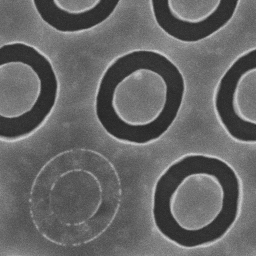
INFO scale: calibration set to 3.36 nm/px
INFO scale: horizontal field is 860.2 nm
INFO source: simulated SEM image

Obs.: ring-shaped grooves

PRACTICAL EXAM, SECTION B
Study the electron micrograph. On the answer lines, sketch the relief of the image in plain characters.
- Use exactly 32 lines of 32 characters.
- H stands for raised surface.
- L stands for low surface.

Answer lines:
HHHHLLLHHHHHLLLHHHHLLHHHHHHLLLHH
HHHHHLLLLHLLLLHHHHHLLLHHHHHLLHHH
HHHHHHLLLLLLLHHHHHHHLLLHHLLLLHHH
HHHHHHHLLLLHHHHHHHHHLLLLLLLLHHHH
HHHHHHHHHHHHHHHHHHHHHLLLLLHHHHHH
HHLHHHHHHHHHHHHHHHHHHHHHHHHHHHHH
LLLLLHHHHHHHHHHHLLLHHHHHHHHHHHHL
LLLLLLHHHHHHHHLLLLLLLHHHHHHHHHLL
HHHHLLLHHHHHHHLLLLLLLLHHHHHHHLLL
HHHHHLLHHHHHHLLLHHHHLLLHHHHHLLHH
HHHHHLLHHHHHHLLHHHHHHLLHHHHLLLHH
HHHHHLLHHHHHLLHHHHHHHLLHHHHLLHHH
HHHHHLLHHHHHLLHHHHHHHLLHHHHLLHHH
HHHHLLLHHHHHLLHHHHHHLLHHHHHLLHHH
HHLLLLHHHHHHLLLHHHHHLLHHHHHLLLHH
LLLLLHHHHHHHHLLLLHLLLHHHHHHHLLLL
LLLLHHHHHHHHHLLLLLLLLHHHHHHHHLLL
HHHHHHHHHHHHHHHLLLLHHHHHHHHHHHLL
HHHHHHHHHHHHHHHHHHHHHHHHHHHHHHHH
HHHHHHHHHHHHHHHHHHHHHHHLLLHHHHHH
HHHHHHHHHHHHHHHHHHHHHHLLLLLLHHHH
HHHHHHHHHHHHHHHHHHHHHLLLLLLLLHHH
HHHHHHHHHHHHHHHHHHHHLLLHHHHLLLHH
HHHHHHHHHHHHHHHHHHHLLLHHHHHHLLHH
HHHHHHHHHHHHHHHHHHHLLLHHHHHHLLHH
HHHHHHHHHHHHHHHHHHHLLHHHHHHHLLHH
HHHHHHHHHHHHHHHHHHHLLHHHHHHLLLHH
HHHHHHHHHHHHHHHHHHHLLLHHHHHLLHHH
HHHHHHHHHHHHHHHHHHHHLLLHHLLLLHHH
HHHHHHHHHHHHHHHHHHHHHLLLLLLLHHHH
HHHHHHHHHHHHHHHHHHHHHHLLLLHHHHHH
HHHHHHHHHHHHHHHHHHHHHHHHHHHHHHHH